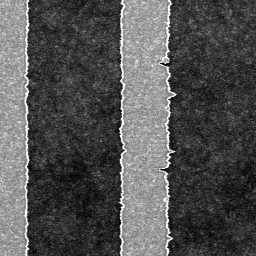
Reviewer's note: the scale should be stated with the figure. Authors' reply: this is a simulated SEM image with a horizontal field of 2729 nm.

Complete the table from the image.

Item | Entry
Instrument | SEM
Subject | one or a few lines or trenches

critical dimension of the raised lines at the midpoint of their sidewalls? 496 nm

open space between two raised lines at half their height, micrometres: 1.01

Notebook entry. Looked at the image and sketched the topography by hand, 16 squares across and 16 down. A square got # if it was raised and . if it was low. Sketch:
##......###.....
##......###.....
##......##......
##......##......
##......##......
##......###.....
##......###.....
##......##......
##......##......
##......###.....
##......##......
##......##......
##......##......
##......##......
##......###.....
##......##......